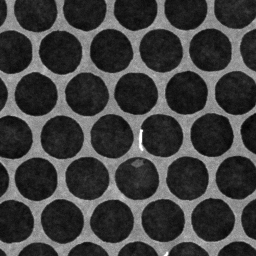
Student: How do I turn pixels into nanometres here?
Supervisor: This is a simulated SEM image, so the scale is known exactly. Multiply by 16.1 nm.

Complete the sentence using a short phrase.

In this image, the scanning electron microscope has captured a regular array of holes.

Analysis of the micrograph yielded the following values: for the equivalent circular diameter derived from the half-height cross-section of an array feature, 702 nm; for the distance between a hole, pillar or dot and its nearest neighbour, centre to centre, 786 nm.